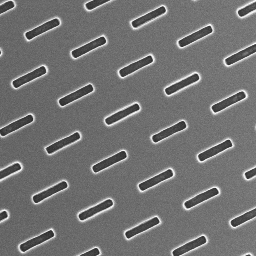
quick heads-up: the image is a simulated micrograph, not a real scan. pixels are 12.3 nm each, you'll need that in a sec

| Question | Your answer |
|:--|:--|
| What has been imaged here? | a regular array of holes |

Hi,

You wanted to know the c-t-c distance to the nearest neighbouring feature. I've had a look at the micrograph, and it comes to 607 nanometres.